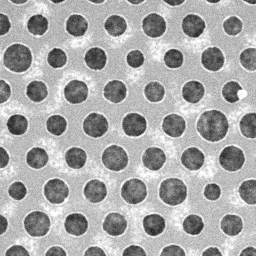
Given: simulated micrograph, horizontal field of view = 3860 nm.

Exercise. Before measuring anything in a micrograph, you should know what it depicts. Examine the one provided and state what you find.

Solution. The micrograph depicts a regular array of holes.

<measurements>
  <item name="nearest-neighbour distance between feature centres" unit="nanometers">575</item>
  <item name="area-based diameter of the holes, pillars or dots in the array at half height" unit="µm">0.358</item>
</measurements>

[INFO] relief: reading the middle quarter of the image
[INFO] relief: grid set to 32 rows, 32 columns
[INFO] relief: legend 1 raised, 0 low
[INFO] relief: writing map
11111100001111110001111111000111
11111111011111111111111111111111
11111111111111111111111111111111
11111111111111111111111111111111
10000111111000011111110111111110
00000011110000001111000001111100
00000011110000001111000001111000
00000011110000001111000001111000
00000011110000011111100001111100
10000111111000111111110011111110
11111111111111111111111111111111
11111111111111111111111111111111
11111100011111110001111111100111
11111000000111100000111110000011
01111000000111000000011100000001
01110000000111000000011100000001
01111000000111100000111110000011
11111000001111100000111110000011
11111111111111111111111111101111
11111111111111111111111111111111
11111111111000111111111111111111
10000111110000011111000001111100
00000011110000001111000001111100
00000011100000001110000000111000
00000011110000001111000001111000
10000111110000001111000001111100
11111111111000011111100011111110
11111111111111111111111111111111
11111111111111111011111111000111
11111100001111100000111100000011
01111000000111000000011100000001
01111000000111000000011100000001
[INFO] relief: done